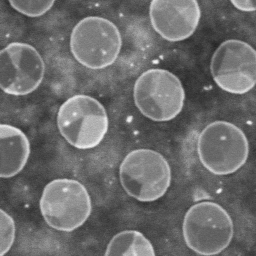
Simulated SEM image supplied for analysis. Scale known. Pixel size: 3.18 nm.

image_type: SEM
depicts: raised bodies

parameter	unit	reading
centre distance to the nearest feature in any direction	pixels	81.1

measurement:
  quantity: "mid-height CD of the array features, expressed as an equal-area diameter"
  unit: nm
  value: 160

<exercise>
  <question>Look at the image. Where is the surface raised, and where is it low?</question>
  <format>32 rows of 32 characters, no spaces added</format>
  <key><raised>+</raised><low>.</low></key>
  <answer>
..++++.............++++++....+++
...+++.............++++++.......
..........+++......++++++.......
.........++++++....+++++........
.........++++++.....+++.........
.........++++++.............+++.
+++++....++++++............+++++
+++++.....++++.............+++++
+++++.....................++++++
+++++.............++++.....+++++
+++++............+++++.....+++++
.+++.............++++++......+..
.........+++.....++++++.........
........+++++....++++++.........
.......++++++.....++++..........
.......++++++..............++...
++......+++++............+++++..
+++.....++++.............++++++.
++++.....................++++++.
+++.............++++.....++++++.
+++............++++++....+++++..
++.............++++++......++...
.......+.......++++++...........
......++++......+++++...........
.....++++++......+++............
.....++++++..............++.....
.....++++++............+++++....
+.....+++++............++++++...
++.....++..............++++++...
++............++++.....++++++...
+.............+++++....+++++....
+............++++++......++.....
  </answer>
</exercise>